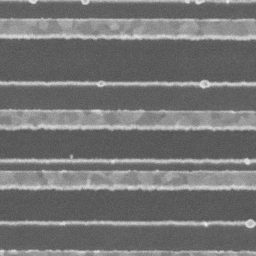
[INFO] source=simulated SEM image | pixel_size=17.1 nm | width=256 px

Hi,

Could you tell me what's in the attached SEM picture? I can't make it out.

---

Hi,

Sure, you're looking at lines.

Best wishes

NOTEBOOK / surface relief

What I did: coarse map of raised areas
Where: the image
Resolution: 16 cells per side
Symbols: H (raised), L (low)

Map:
HHHHHHHHHHHHHHHH
HHHHHHHHHHHHHHHH
LLLLLLLLLLLLLLLL
LLLLLLLLLLLLLLLL
LLLLLLLLLLLLLLLL
HHHHHHHHHHHHHHHH
HHHHHHHHHHHHHHHH
HHHHHHHHHHHHHHHH
LLLLLLLLLLLLLLLL
LLLLLLLLLLLLLLLL
HHHHHHHHHHHHHHHH
HHHHHHHHHHHHHHHH
LLLLLLLLLLLLLLLL
LLLLLLLLLLLLLLLL
HHHHHHHHHHHHHHHH
HHHHHHHHHHHHHHHH